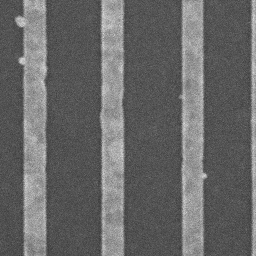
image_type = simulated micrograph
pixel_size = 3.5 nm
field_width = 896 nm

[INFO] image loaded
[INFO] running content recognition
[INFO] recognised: one or a few lines or trenches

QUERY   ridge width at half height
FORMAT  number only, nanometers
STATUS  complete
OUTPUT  74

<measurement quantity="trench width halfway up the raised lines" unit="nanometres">197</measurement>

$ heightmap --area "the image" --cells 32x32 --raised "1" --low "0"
00011100000001100000000110000000
00011100000001100000000110000000
00011100000001100000000110000000
00011100000001100000000110000000
00011100000001100000000110000000
00011100000001100000000110000000
00011100000001100000000110000000
00011100000001100000000110000000
00011100000001100000000110000000
00011100000001100000000110000000
00011100000001100000000110000000
00011100000001100000000110000000
00011100000001100000000110000000
00011100000001100000000110000000
00011100000001100000000110000000
00011100000001100000000110000000
00011100000001100000000110000000
00011100000001100000000110000000
00011100000001100000000110000000
00011100000001100000000110000000
00011100000001100000000110000000
00011100000001100000000110000000
00011100000001100000000110000000
00011100000001100000000110000000
00011100000001100000000110000000
00011100000001100000000110000000
00011100000001100000000110000000
00011100000001100000000110000000
00011100000001100000000110000000
00011100000001100000000110000000
00011100000001100000000110000000
00011100000001100000000110000000